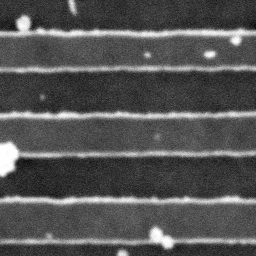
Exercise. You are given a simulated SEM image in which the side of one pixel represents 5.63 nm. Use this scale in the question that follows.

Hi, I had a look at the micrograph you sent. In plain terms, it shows lines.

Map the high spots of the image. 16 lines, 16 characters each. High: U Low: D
DDDDDDDDDDDDDDDD
DUDDDDDDDDDDDDDD
UUUUUUUUUUUUUUUU
UUUUUUUUUUUUUUUU
DDDDDDDDDDDDDDDD
DDDDDDDDDDDDDDDD
DDDDDDDDDDDDDDDD
UUUUUUUUUUUUUUUU
UUUUUUUUUUUUUUUU
UUUUUUUUUUUUUUUU
UDDDDDDDDDDDDDDD
DDDDDDDDDDDDDDDD
UUUDUUUUUDUUDUUU
UUUUUUUUUUUUUUUU
UUUUUUUUUUUUUUUU
DDDDDDDDDDDDDDDD